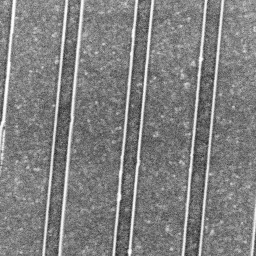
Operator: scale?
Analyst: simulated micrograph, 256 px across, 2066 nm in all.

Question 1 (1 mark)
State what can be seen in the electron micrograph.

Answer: one or a few lines or trenches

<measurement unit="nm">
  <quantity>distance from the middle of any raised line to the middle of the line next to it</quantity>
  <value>559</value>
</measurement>